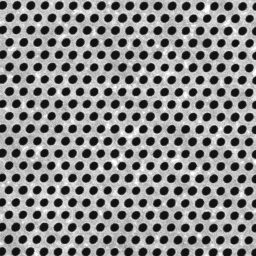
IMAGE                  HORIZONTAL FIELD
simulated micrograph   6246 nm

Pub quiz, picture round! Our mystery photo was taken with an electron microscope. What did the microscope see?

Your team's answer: a regular array of holes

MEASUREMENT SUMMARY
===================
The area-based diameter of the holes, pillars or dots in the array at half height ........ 224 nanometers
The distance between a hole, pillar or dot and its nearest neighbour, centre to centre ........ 340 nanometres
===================